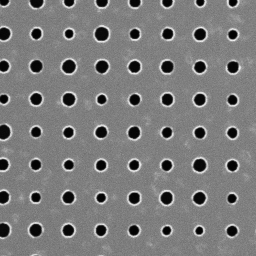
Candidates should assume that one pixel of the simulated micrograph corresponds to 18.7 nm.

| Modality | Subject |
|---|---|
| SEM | a regular array of holes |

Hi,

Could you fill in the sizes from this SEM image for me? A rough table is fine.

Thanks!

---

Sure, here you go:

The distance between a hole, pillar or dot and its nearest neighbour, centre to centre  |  606 nanometres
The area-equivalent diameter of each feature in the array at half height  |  211 nm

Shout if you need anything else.